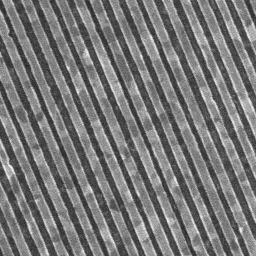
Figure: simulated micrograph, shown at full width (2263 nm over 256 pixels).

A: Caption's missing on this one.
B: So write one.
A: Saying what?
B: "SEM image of parallel lines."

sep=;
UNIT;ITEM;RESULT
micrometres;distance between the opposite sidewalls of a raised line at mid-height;0.0783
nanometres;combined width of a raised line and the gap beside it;144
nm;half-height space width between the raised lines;70.3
